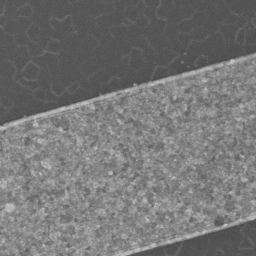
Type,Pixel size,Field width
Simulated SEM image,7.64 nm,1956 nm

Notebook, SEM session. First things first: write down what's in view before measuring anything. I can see one or a few lines or trenches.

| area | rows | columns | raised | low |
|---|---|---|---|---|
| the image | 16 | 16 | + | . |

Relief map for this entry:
................
................
................
................
............++++
.........+++++++
.....+++++++++++
..++++++++++++++
++++++++++++++++
++++++++++++++++
++++++++++++++++
++++++++++++++++
++++++++++++++++
++++++++++++++++
+++++++++++++...
+++++++++.......